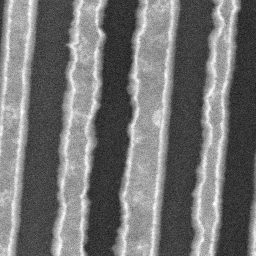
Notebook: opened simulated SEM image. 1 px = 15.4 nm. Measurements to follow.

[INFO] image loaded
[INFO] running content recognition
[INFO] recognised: one or a few lines or trenches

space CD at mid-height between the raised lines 586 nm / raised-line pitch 67.7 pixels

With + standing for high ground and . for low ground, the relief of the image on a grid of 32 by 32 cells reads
.+++......+++.....++++.....+++..
.+++.....++++....+++++.....+++..
.+++.....+++.....+++++.....++...
.+++.....+++.....+++++.....++...
.+++.....++++....+++++.....++...
++++.....++++....+++++....+++...
.+++.....+++.....+++++....+++...
++++.....++++....++++.....+++...
+++......+++.....++++.....+++...
+++......+++....+++++.....+++...
+++......++++...+++++.....+++...
+++......+++....+++++.....++....
+++.....++++.....++++.....++....
+++.....++++.....++++.....++....
+++.....++++.....++++.....++....
+++.....+++.....+++++.....++....
+++.....+++.....+++++.....++....
+++.....++++....+++++.....++....
+++.....++++....+++++.....++....
+++.....+++.....++++.....+++....
+++.....+++.....++++.....+++....
+++.....+++.....++++.....+++....
++.....++++.....++++.....+++....
++......+++....+++++.....+++....
++.....++++....+++++....++++....
++......+++....+++++....+++.....
++......+++....+++++....+++.....
++.....++++....+++++....+++.....
++.....++++....+++++.....++....+
++.....+++.....+++++.....++....+
++.....+++.....+++++....+++....+
++.....+++.....++++.....+++....+